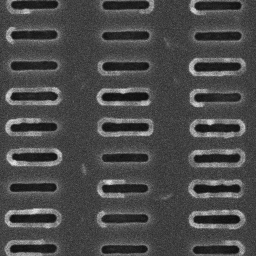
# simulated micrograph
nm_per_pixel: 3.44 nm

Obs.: a regular array of holes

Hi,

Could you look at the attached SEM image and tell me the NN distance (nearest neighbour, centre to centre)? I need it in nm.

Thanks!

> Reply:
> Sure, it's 105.